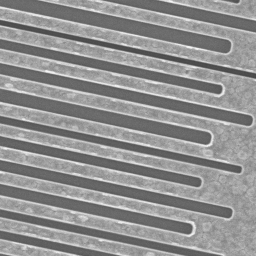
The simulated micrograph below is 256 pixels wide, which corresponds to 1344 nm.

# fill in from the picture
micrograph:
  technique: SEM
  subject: parallel lines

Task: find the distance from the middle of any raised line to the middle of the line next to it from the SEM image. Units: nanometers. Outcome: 122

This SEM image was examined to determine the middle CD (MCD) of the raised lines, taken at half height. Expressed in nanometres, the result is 66.7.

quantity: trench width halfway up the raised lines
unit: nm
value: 56.5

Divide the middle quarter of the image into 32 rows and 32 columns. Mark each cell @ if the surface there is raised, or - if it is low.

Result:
@@@--------------@@@@@@@@@@@@@@@
@@@@@@@@--------------@@@@@@@@@@
@@@@@@@@@@@@@--------------@@@@@
---@@@@@@@@@@@@@@@-------------@
--------@@@@@@@@@@@@@@@---------
------------@@@@@@@@@@@@@@@-----
@@---------------@@@@@@@@@@@@@@@
@@@@@@@---------------@@@@@@@@@@
@@@@@@@@@@@@---------------@@@@@
@@@@@@@@@@@@@@@@@--------------@
-----@@@@@@@@@@@@@@@@-----------
----------@@@@@@@@@@@@@@@@------
---------------@@@@@@@@@@@@@@@@-
@@-----------------@@@@@@@@@@@@@
@@@@@@@-----------------@@@@@@@@
@@@@@@@@@@@@-----------------@@@
--@@@@@@@@@@@@@@@---------------
------@@@@@@@@@@@@@@@-----------
@----------@@@@@@@@@@@@@@@------
@@@@@@----------@@@@@@@@@@@@@@@-
@@@@@@@@@@-----------@@@@@@@@@@@
--@@@@@@@@@@@@@-----------@@@@@@
------@@@@@@@@@@@@@@----------@@
-----------@@@@@@@@@@@@@@-------
@@--------------@@@@@@@@@@@@@@--
@@@@@@@--------------@@@@@@@@@@@
@@@@@@@@@@@@--------------@@@@@@
--@@@@@@@@@@@@@@@-------------@@
-------@@@@@@@@@@@@@@@----------
-----------@@@@@@@@@@@@@@@------
@---------------@@@@@@@@@@@@@@@-
@@@@@@---------------@@@@@@@@@@@